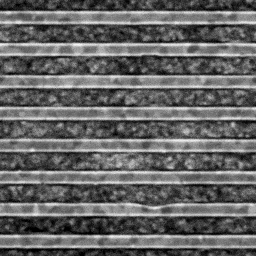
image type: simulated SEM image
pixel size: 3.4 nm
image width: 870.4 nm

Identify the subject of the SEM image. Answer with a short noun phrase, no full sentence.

parallel lines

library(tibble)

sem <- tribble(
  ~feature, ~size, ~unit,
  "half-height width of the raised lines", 38.7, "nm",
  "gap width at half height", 70.9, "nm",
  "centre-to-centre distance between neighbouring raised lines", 0.109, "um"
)